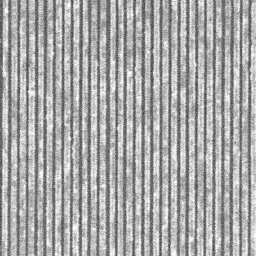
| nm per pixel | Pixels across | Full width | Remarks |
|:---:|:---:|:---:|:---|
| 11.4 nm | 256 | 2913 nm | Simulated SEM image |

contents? parallel lines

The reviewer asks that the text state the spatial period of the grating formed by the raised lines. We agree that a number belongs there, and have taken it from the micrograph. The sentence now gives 0.101 µm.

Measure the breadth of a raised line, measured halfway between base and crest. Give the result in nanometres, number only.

58.3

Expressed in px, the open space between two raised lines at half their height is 4.25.